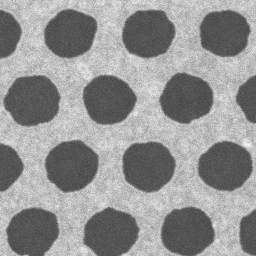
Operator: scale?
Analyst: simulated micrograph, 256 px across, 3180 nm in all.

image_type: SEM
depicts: a regular array of holes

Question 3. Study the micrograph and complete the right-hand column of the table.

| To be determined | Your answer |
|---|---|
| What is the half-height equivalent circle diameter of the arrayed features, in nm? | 647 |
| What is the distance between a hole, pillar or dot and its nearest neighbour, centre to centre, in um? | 0.941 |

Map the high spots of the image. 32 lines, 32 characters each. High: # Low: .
################################
.######...#######....#####....##
..####......####.....####......#
...###......###.......###......#
...###......###.......###......#
..####......###......####......#
..####.....#####.....#####....##
################################
################################
###...######..########..########
##.....####.....#####.....####..
#......###.......###.......###..
........##.......###.......##...
#......####......###......####..
#......####.....#####.....#####.
##...#######..#########.########
################################
#########.######################
..#####....#####.....#####.....#
..####......###.......###......#
...###......###.......###.......
...###......###.......###.......
..####......####.....####......#
.######....######...#######...##
################################
################################
##....######....#####.....#####.
#......####......###......####..
#......###.......###.......###..
#......###.......###.......###..
#......####......###......####..
##....######....#####....######.